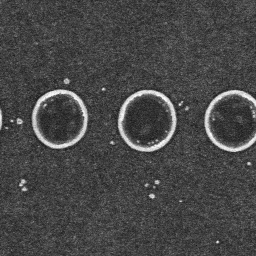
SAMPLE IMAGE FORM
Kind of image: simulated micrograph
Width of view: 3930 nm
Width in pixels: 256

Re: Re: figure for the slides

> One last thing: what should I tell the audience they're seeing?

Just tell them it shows raised bodies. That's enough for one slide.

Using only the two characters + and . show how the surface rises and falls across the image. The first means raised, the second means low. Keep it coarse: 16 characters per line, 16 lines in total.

................
................
................
................
................
................
..+++...+++..+++
..+++...+++..+++
...++...+++..+++
................
................
................
................
................
................
................